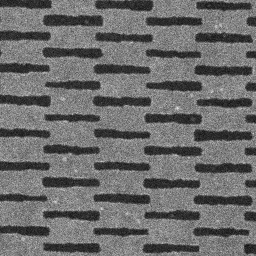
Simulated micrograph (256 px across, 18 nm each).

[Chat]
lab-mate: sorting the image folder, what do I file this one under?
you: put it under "a regular array of holes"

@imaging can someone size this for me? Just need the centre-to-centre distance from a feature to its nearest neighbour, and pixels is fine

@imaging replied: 32.2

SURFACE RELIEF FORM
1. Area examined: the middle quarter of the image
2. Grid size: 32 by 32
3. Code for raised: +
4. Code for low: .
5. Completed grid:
++++++++.............+++++++++++
+++++++...............++++++++++
++++++++......+......+++++++++++
++++++++++++++++++++++++++++++++
.........++++++++++++...........
.........+++++++++++............
++.......+++++++++++++..........
++++++++++++++++++++++++++++++++
+++++++...............++++++++++
+++++++...............++++++++++
++++++++.............+++++++++++
++++++++++++++++++++++++++++++++
....++.+++++++++++++............
.........+++++++++++............
+...++...+++++++++++............
++++++++++++++++++++++++++++++++
++++++++......++++++++++++++++++
+++++++...............++++++++++
++++++++..............++++++++++
++++++++++++++++++++++++++++++++
..+.++++++++++++++++....+++.....
.........+++++++++++............
.........+++++++++++............
++++++++++++++++++++++++++++++++
++++++++.............+++++++++++
+++++++...............++++++++++
++++++++.............+++++++++++
++++++++++++++++++++++++++++++++
.......++++++++++++++....+++++++
.........+++++++++++............
.........+++++++++++............
++++++++++++++++++++++++++++++++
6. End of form